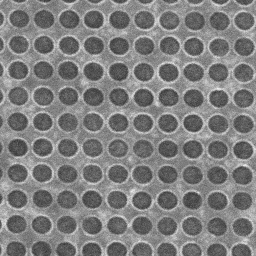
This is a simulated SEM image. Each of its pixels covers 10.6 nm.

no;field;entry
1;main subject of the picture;a regular array of holes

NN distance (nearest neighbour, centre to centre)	24.9	pixels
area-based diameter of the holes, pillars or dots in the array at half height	209	nanometres